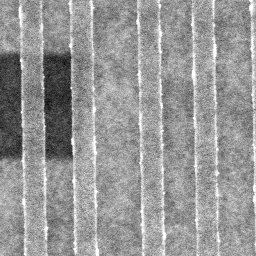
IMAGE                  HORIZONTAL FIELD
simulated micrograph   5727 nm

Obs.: lines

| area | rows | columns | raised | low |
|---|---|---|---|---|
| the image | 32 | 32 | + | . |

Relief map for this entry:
...++....++......+++....+++....+
...++....++......+++....+++....+
...++....++......+++....+++.....
...++....++......+++....+++.....
...++....++......+++....+++.....
...++....+++.....+++....+++.....
...++....+++.....+++....+++.....
...++....+++.....+++....+++.....
...++....+++.....+++....+++.....
...++....+++.....+++....+++.....
...++....+++.....+++....+++.....
...++....+++......++....+++.....
...++....+++......++....+++.....
...++....+++......++....+++.....
...++....+++......++....+++.....
...++....+++......++....+++.....
...++....+++......++....+++.....
...++....+++......++....+++.....
...++....+++......++....+++.....
...++....+++......++....+++.....
...++....+++......++....+++.....
...+++...+++......++....+++.....
...+++...+++......++....+++.....
...+++...+++......++.....++.....
...+++...+++......++.....++.....
...+++...+++......++.....++.....
...+++...+++......++.....++.....
...+++...+++......++.....++.....
...+++...+++......++.....++.....
...+++...+++......++.....++.....
...+++...+++......++.....++.....
...+++...+++......++.....++.....